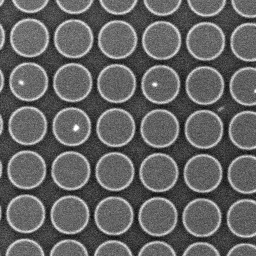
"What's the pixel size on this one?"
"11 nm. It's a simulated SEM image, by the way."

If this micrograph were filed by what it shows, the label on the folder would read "an array of small figures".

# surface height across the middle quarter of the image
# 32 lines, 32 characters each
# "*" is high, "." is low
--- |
****.......****.................
******....******.....******.....
******...********...********...*
*******..*********..*********..*
*******..*********..*********..*
*******..*********..*********..*
*******..*********..*********..*
******...********...********...*
*****.....******.....******.....
............**.........***......
................................
****.......***..................
*****.....******.....******.....
******...********...********...*
******...********...********...*
*******.**********.**********.**
******..**********.**********.**
******..*********..*********..**
******...********...********...*
*****.....******.....******.....
............**........****......
................................
****.......***..................
*****....*******.....******.....
******...********...********...*
******..*********..*********..**
******..*********..*********..**
******..*********..*********..**
******..*********..*********..**
*****....********...********...*
****......******....*******....*
............**........****......